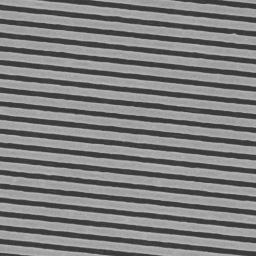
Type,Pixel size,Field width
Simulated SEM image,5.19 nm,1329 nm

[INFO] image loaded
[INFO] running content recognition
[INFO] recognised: parallel lines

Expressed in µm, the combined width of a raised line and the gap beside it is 0.0711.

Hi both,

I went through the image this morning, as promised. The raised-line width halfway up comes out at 45.1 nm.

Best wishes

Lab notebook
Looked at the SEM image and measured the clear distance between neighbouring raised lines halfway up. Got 27.1 nm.